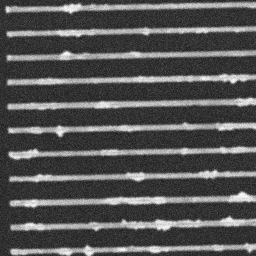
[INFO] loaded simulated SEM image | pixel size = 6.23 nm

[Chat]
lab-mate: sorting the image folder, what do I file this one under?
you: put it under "parallel lines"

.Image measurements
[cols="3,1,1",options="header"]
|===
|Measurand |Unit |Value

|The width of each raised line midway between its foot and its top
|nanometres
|28.8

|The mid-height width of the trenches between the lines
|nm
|121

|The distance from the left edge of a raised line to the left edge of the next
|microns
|0.151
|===